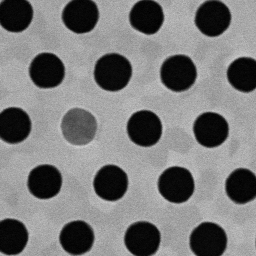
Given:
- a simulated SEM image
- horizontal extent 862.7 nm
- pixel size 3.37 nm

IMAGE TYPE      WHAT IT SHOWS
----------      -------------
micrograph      a regular array of holes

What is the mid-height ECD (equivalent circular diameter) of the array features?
122 nm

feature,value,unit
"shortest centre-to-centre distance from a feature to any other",218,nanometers